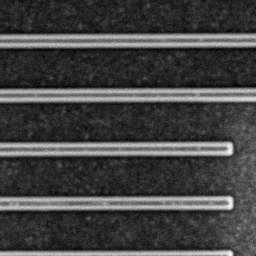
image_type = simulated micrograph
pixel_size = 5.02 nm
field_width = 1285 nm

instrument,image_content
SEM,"parallel lines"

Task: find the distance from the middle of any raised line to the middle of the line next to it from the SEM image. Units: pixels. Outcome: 54.2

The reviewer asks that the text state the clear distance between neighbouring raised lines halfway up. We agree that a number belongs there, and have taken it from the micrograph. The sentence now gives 43.5 px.